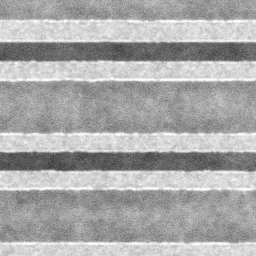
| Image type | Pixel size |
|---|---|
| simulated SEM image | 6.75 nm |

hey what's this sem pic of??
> lines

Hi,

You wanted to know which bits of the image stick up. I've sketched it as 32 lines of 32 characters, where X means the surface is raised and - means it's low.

--------------------------------
--------------------------------
--------------------------------
XXXXXXXXXXXXXXXXXXXXXXXXXXXXXXXX
XXXXXXXXXXXXXXXXXXXXXXXXXXXXXXXX
--------------------------------
--------------------------------
--------------------------------
XXXXXXXXXXXXXXXXXXXXXXXXXXXXXXXX
XXXXXXXXXXXXXXXXXXXXXXXXXXXXXXXX
--------------------------------
--------------------------------
--------------------------------
--------------------------------
--------------------------------
--------------------------------
--------------------------------
XXXXXXXXXXXXXXXXXXXXXXXXXXXXXXXX
XXXXXXXXXXXXXXXXXXXXXXXXXXXXXXXX
--------------------------------
--------------------------------
XXXXXXXXXXXXXXXXXXXXXXX-XXXXXXXX
XXXXXXXXXXXXXXXXXXXXXXXXXXXXXXXX
XXXXXXXXXXXXXXXXXXXXXXXXXXXXXXXX
--------------------------------
--------------------------------
--------------------------------
--------------------------------
--------------------------------
--------------------------------
XXXXXXXXXXXXXXXXXXXXXXX-XXXXX-XX
XXXXXXXXXXXXXXXXXXXXXXXXXXXXXXXX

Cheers